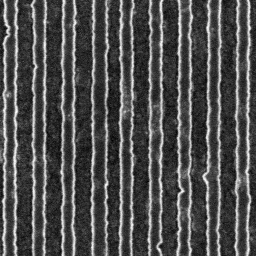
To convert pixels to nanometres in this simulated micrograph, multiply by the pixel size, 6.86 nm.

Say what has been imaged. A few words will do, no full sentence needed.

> parallel lines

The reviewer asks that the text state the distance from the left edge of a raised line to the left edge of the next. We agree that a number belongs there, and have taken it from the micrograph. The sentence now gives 199 nm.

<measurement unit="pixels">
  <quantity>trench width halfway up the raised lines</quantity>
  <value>17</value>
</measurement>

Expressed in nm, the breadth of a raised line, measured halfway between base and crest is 84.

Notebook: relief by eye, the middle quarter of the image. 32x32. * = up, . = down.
**.....****...***....***.....***
**.....***....***....***.....***
***....****...***.....**.....***
**.....****....**....***.....***
**.....****...***....***....****
**.....****...***.....**.....***
**.....****...***....***.....***
**.....****....**....***.....**.
**.....****...***....***.....**.
**.....***....***.....**.....***
**.....***....***.....**.....***
**.....****...***.....**.....**.
**.....****...***.....**.....***
**.....****...***.....**....****
**.....***....***....***.....***
**.....****...***....***.....***
***....****...***....***.....***
**.....****...***.....***....**.
**.....****...***.....***....**.
**.....****...***....****....***
***....****...***....***.....***
***....****...***....***.....**.
***....****...***....***.....**.
***....****...***....***.....***
**.....****...***.....**.....***
**.....***....***.....**.....***
**.....****...***....***.....**.
**.....****...***.....**.....**.
***....****...***.....**.....**.
***....****...***.....**.....***
**.....****...***.....**.....***
**.....****...***.....**.....***